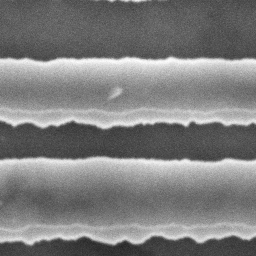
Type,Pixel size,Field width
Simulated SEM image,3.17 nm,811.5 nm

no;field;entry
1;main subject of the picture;lines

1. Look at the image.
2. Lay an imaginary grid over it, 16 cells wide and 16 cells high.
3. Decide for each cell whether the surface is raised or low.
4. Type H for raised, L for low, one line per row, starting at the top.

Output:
LLLLLLLLLLLLLLLL
LLLLLLLLLLLLLLLL
LLLLLLLLLLLLLLLL
LLLLLLLLLLLLLLLL
HHHHHHHHHHHHHHHH
HHHHHHHHHHHHHHHH
HHHHHHHHHHHHHHHH
HHHHHHHHHHHHHHHH
LLLLLLLLLLLLLLLL
LLLLLLLLLLLLLLLL
HHHHHHHHHHHHHHHH
HHHHHHHHHHHHHHHH
HHHHHHHHHHHHHHHH
HHHHHHHHHHHHHHHH
HHHHHHHHHHHHHHHH
LLLLLLLLLLLLLLLL